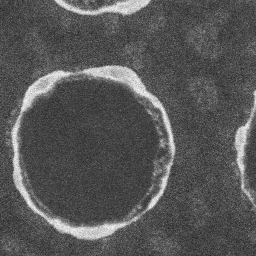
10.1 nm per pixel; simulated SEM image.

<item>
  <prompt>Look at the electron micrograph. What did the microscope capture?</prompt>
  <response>raised bodies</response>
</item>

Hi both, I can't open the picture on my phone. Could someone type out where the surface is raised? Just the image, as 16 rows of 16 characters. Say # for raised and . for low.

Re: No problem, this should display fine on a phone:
....###.........
................
................
................
................
..#######.......
..########......
.#########......
.##########....#
.##########....#
.##########....#
.#########.....#
..########......
...######.......
.....#..........
................